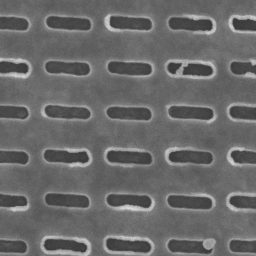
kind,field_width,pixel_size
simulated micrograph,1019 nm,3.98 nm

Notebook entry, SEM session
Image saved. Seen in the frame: a regular array of holes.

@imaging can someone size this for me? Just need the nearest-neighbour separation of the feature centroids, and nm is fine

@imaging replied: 177